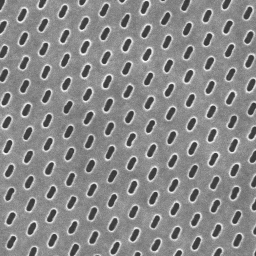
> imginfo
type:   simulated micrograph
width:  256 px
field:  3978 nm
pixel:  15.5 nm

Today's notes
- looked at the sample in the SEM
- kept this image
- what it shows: a regular array of holes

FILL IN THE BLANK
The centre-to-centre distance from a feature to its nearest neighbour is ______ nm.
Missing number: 358